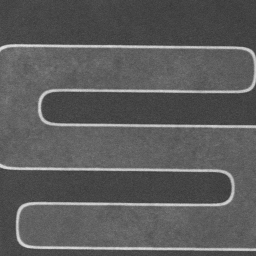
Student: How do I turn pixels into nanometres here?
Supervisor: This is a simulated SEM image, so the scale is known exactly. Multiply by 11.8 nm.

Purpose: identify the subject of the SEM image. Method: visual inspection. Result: groups of lines, slits or small figures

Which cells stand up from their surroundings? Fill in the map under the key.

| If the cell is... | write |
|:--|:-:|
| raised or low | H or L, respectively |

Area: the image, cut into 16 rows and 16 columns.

LLLLLLLLLLLLLLLL
LLLLLLLLLLLLLLLL
LLLLLLLLLLLLLLLL
HHHHHHHHHHHHHHHH
HHHHHHHHHHHHHHHH
HHHHHHHHHHHHHHHH
HHLLLLLLLLLLLLLL
HHHLLLLLLLLLLLLL
HHHHHHHHHHHHHHHH
HHHHHHHHHHHHHHHH
HHHHHHHHHHHHHHHH
LLLLLLLLLLLLLLHH
LLLLLLLLLLLLLLHH
LHHHHHHHHHHHHHHH
LHHHHHHHHHHHHHHH
LLLLLLLLLHHHHHHH